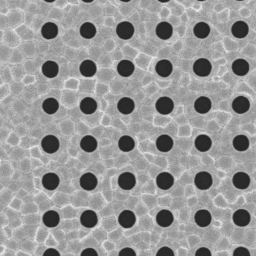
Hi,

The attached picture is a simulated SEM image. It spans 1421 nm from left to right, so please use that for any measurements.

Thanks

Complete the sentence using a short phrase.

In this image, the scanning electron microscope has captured a regular array of holes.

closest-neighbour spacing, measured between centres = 208 nanometers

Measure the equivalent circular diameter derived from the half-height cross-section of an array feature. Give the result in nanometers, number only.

95.7